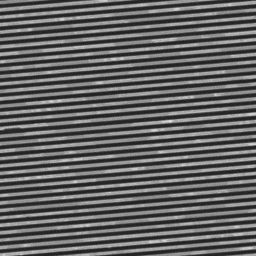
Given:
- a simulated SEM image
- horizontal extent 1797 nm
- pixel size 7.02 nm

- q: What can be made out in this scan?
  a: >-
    parallel lines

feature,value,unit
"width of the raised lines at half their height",20.1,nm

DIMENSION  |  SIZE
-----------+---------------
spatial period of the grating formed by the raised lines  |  52 nanometres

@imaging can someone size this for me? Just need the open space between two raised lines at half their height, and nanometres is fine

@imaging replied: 28